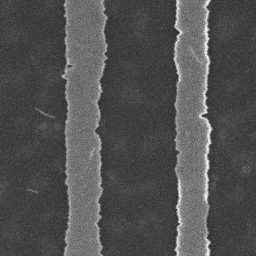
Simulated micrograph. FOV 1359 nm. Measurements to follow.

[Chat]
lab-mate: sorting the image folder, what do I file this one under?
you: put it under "one or a few lines or trenches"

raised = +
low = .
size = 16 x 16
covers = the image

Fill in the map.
....++.....++...
....+++....++...
....+++....++...
....+++....++...
....++.....++...
....++.....++...
....++.....++...
....++.....++...
....++.....++...
....++.....++...
....++.....++...
....++.....++...
....++.....++...
....++.....++...
....++.....++...
....++.....++...